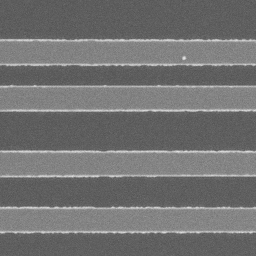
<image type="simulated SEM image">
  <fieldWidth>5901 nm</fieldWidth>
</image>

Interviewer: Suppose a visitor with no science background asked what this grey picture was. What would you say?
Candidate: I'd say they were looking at lines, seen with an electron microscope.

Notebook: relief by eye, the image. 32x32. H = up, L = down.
LLLLLLLLLLLLLLLLLLLLLLLLLLLLLLLL
LLLLLLLLLLLLLLLLLLLLLLLLLLLLLLLL
LLLLLLLLLLLLLLLLLLLLLLLLLLLLLLLL
LLLLLLLLLLLLLLLLLLLLLLLLLLLLLLLL
LLLLLLLLLLLLLLLLLLLLLLLLLLLLLLLL
HHHHHHHHHHHHHHHHHHHHHHHHHHHHHHHH
HHHHHHHHHHHHHHHHHHHHHHHHHHHHHHHH
HHHHHHHHHHHHHHHHHHHHHHHHHHHHHHHH
LLLLLLLLLLLLLLLLLLLLLLLLLLLLLLLL
LLLLLLLLLLLLLLLLLLLLLLLLLLLLLLLL
LLLLLLLLLLLLLLLLLLLLLLLLLLLLLLLL
HHHHHHHHHHHHHHHHHHHHHHHHHHHHHHHH
HHHHHHHHHHHHHHHHHHHHHHHHHHHHHHHH
HHHHHHHHHHHHHHHHHHHHHHHHHHHHHHHH
LLLLLLLLLLLLLLLLLLLLLLLLLLLLLLLL
LLLLLLLLLLLLLLLLLLLLLLLLLLLLLLLL
LLLLLLLLLLLLLLLLLLLLLLLLLLLLLLLL
LLLLLLLLLLLLLLLLLLLLLLLLLLLLLLLL
LLLLLLLLLLLLLLLLLLLLLLLLLLLLLLLL
HHHHHHHHHHHHHHHHHHHHHHHHHHHHHHHH
HHHHHHHHHHHHHHHHHHHHHHHHHHHHHHHH
HHHHHHHHHHHHHHHHHHHHHHHHHHHHHHHH
LLLLLLLLLLLLLLLLLLLLLLLLLLLLLLLL
LLLLLLLLLLLLLLLLLLLLLLLLLLLLLLLL
LLLLLLLLLLLLLLLLLLLLLLLLLLLLLLLL
LLLLLLLLLLLLLLLLLLLLLLLLLLLLLLLL
HHHHHHHHHHHHHHHHHHHHHHHHHHHHHHHH
HHHHHHHHHHHHHHHHHHHHHHHHHHHHHHHH
HHHHHHHHHHHHHHHHHHHHHHHHHHHHHHHH
LLLLLLLLLLLLLLLLLLLLLLLLLLLLLLLL
LLLLLLLLLLLLLLLLLLLLLLLLLLLLLLLL
LLLLLLLLLLLLLLLLLLLLLLLLLLLLLLLL